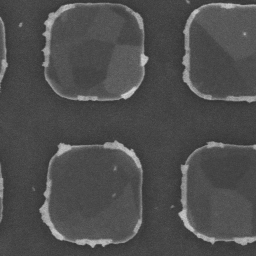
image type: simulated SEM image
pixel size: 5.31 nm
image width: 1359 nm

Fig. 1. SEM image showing raised bodies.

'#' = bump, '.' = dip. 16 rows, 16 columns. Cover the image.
....####....####
...######...####
...######...####
...######...####
...######..#####
...######...####
................
................
................
....####....####
...######..#####
...######..#####
...######..#####
...######..#####
...######...####
................